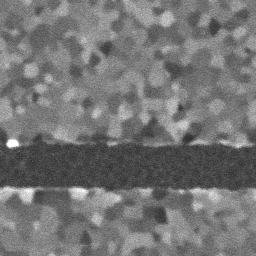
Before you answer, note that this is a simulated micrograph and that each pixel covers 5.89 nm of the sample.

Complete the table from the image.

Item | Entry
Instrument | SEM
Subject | one or a few lines or trenches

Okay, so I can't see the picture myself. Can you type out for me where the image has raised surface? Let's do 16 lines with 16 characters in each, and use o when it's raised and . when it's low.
oooooooooooooooo
oooooooooooooooo
oooooooooooooooo
oooooooooooooooo
oooooooooooooooo
oooooooooooooooo
oooooooooooooooo
oooooooooooooooo
oooooooooooooooo
................
................
................
oooooooooooooooo
oooooooooooooooo
oooooooooooooooo
oooooooooooooooo